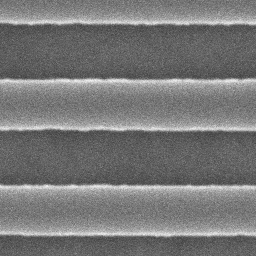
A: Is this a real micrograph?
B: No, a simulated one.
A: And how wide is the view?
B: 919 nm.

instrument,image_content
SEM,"lines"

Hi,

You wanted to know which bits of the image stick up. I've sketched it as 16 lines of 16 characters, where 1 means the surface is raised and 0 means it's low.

1111111111111111
0000000000000000
0000000000000000
0000000000000000
0000000000000000
1111111111111111
1111111111111111
1111111111111111
0000000000000000
0000000000000000
0000000000000000
0000000000000000
1111111111111111
1111111111111111
1111111111111111
0000000000000000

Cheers